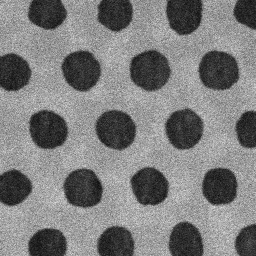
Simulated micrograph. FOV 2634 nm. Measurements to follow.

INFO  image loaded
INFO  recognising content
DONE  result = a regular array of holes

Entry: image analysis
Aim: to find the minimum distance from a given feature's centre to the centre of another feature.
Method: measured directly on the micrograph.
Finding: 691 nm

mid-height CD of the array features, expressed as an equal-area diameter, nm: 405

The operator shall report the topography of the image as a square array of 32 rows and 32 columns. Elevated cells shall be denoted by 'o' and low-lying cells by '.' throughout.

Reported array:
oooo....oooo....ooooo....oooo...
oooo....oooo.....oooo....oooo...
oooo....oooo....ooooo....ooooo..
ooooo..oooooo...ooooo....oooooo.
oooooooooooooooooooooooooooooooo
oooooooooooooooooooooooooooooooo
ooooooooo..ooooooo..oooooo..oooo
...ooooo....ooooo....oooo....ooo
....oooo.....ooo.....oooo.....oo
....oooo.....ooo.....oooo.....oo
...oooooo...ooooo....oooo....ooo
oooooooooooooooooooooooooooooooo
oooooooooooooooooooooooooooooooo
oooooooooooooooooooooooooooooooo
oooo....ooooo...ooooo....ooooo..
oooo....oooo.....oooo....ooooo..
oooo.....ooo.....oooo....oooo...
oooo....oooo.....oooo....ooooo..
ooooo..ooooooo..oooooo..oooooooo
oooooooooooooooooooooooooooooooo
oooooooooooooooooooooooooooooooo
o..oooooo...ooooo...oooooo...ooo
....oooo....oooo.....oooo.....oo
....oooo.....ooo.....oooo.....oo
....oooo.....oooo....ooooo...ooo
o.ooooooo...oooooo..ooooooo.oooo
oooooooooooooooooooooooooooooooo
oooooooooooooooooooooooooooooooo
oooooooooooooo..oooooo...ooooo..
oooo....ooooo...ooooo....ooooo..
oooo....oooo.....oooo....oooo...
oooo....oooo.....oooo....ooooo..